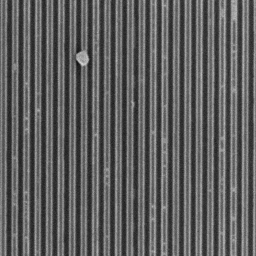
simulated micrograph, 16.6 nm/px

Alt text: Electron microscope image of parallel lines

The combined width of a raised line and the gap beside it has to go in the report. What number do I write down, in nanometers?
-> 191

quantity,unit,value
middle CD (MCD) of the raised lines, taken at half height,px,4.88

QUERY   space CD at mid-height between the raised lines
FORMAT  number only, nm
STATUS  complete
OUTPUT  112